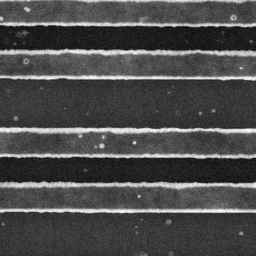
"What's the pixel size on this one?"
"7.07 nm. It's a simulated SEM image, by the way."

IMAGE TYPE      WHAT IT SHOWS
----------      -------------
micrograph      lines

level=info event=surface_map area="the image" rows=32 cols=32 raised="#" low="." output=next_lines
################################
################################
################################
................................
................................
................................
###########################.....
################################
################################
################################
................................
................................
................................
................................
................................
................................
################################
################################
################################
################################
................................
................................
................................
################################
################################
################################
................................
................................
................................
................................
................................
................................